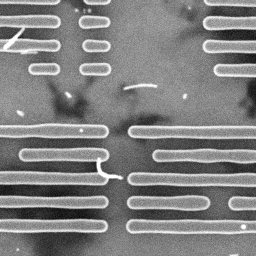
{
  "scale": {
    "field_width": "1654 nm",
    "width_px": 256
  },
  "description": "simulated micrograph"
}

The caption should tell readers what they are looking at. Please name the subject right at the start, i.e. groups of lines, slits or small figures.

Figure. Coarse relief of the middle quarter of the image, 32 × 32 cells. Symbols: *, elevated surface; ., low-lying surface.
....********....................
....********....................
.....******.....................
................................
................................
................................
................................
................................
................................
................................
................................
................................
................................
................................
................................
**********......................
***********.....****************
***********.....****************
................................
................................
................................
**********......................
***********...........**********
***********...........**********
........*.......................
........*.......................
................................
***********......************...
***********.....****************
***********.....****************
................................
................................